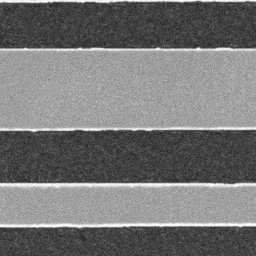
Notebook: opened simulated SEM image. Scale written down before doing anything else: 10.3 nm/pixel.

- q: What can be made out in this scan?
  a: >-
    lines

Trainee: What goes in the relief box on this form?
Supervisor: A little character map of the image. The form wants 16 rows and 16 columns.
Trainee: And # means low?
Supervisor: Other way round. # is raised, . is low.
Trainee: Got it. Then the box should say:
................
................
................
################
################
################
################
################
................
................
................
##############.#
################
################
................
................